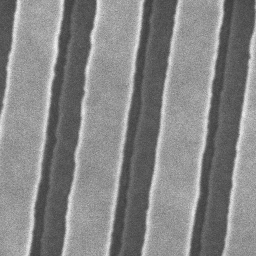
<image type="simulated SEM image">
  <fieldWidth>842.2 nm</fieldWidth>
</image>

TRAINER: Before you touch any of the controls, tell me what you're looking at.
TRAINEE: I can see lines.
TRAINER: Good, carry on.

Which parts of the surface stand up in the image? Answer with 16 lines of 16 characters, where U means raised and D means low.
DUUUDDUUUDDUUUDD
DUUUDDUUUDDUUUDD
DUUUDDUUUDDUUUDD
DUUUDDUUUDDUUUDD
UUUDDUUUDDUUUDDU
UUUDDUUUDDUUUDDU
UUUDDUUUDDUUUDDU
UUUDDUUUDDUUUDDU
UUUDDUUUDDUUUDDU
UUUDDUUUDDUUUDDU
UUUDDUUUDDUUUDDU
UUDDDUUDDUUUDDDU
UUDDUUUDDUUUDDUU
UUDDUUUDDUUUDDUU
UUDDUUUDDUUUDDUU
UUDDUUUDDUUUDDUU